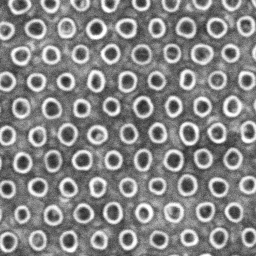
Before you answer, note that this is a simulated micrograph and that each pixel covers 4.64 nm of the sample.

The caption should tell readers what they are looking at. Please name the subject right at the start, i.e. a regular array of raised bodies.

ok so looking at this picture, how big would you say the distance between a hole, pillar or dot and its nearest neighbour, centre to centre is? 135 nm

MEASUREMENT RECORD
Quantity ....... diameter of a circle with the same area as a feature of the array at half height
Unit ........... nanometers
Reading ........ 82.9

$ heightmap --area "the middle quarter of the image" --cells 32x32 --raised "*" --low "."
................................
................................
*......**......**.....**......**
**....****....****...****.....**
**....****....****...****....***
**....****....****....***....***
.......**.....***...............
................................
...................**.....**....
...***....****....***.....***...
...***....****....****....***...
...***....****....****....***...
...***.....**.....***.....***...
................................
................................
**.............**.....**.....***
***....***....****...****....***
***...*****...****....****...***
***...*****...****....***....***
**.....***.....**......*......**
................................
................................
...****....***....****....***...
..*****....***....****...*****..
..*****....***....****...*****..
...****....***....***.....***...
...................*.......*....
................................
.............................***
**.....***....****....***....***
***....***....****....***....***
***....***....****....***....***